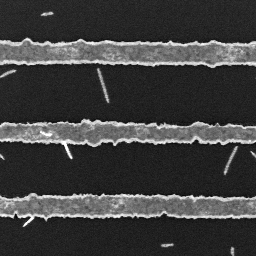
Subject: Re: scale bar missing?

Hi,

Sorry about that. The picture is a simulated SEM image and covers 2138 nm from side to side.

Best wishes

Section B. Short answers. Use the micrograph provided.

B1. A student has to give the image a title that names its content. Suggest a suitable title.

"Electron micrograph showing one or a few lines or trenches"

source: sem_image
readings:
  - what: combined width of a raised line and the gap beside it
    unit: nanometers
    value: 640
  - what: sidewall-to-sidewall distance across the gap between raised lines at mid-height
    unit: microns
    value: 0.498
